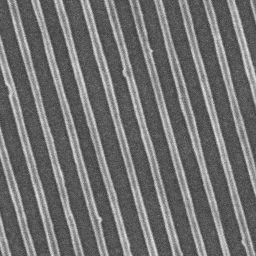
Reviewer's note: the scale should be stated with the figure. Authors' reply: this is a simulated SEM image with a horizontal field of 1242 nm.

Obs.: parallel lines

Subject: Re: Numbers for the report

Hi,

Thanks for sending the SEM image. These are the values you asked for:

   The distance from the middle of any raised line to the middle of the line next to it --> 114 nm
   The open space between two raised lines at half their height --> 0.0831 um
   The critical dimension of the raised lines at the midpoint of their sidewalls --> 0.0322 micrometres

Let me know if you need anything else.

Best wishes